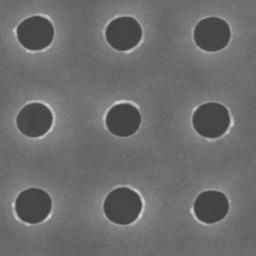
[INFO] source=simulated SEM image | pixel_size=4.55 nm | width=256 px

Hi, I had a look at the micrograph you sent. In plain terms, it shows a regular array of holes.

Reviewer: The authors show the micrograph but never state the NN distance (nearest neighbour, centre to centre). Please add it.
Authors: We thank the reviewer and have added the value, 86.2 px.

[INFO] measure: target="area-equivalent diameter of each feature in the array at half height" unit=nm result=162